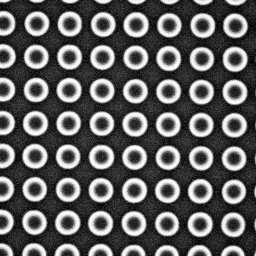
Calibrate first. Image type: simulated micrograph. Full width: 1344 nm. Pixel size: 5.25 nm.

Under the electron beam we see an array of small figures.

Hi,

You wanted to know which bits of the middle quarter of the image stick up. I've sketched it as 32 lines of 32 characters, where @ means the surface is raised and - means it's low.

@@@-----@@@@----@@@@----@@@@@---
-------------------------@@-----
--------------------------------
--------------------------------
@@@-----@@@-----@@@@-----@@@----
@@@@---@@@@@---@@@@@----@@@@@---
@@@@---@@@@@---@@@@@@--@@@@@@---
@@@@---@@@@@---@@@@@@--@@@@@@---
@@@----@@@@@---@@@@@----@@@@@---
-----------------@@------@@-----
--------------------------------
--------------------------------
@@@-----@@@-----@@@------@@-----
@@@@---@@@@@---@@@@@----@@@@----
@@@@---@@@@@---@@@@@@--@@@@@@---
@@@@---@@@@@---@@@@@@--@@@@@@---
@@@@---@@@@@---@@@@@----@@@@@---
@@------@@@-----@@@-----@@@@----
--------------------------------
--------------------------------
@@---------------@@-------------
@@@----@@@@@---@@@@@----@@@@----
@@@@---@@@@@---@@@@@---@@@@@@---
@@@@--@@@@@@---@@@@@@--@@@@@@--@
@@@@---@@@@@---@@@@@---@@@@@@---
@@@----@@@@-----@@@@----@@@@----
--------------------------------
--------------------------------
--------------------------------
@@@----@@@@-----@@@@----@@@@----
@@@@---@@@@@---@@@@@---@@@@@@---
@@@@--@@@@@@---@@@@@@--@@@@@@--@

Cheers